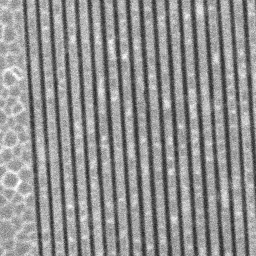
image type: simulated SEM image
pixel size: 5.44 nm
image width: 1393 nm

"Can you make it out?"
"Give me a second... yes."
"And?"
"parallel lines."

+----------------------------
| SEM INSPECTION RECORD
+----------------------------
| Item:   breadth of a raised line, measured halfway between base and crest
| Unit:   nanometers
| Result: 40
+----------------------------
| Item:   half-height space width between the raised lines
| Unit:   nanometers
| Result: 29.8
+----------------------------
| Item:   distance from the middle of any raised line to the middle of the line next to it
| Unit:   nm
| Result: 70.2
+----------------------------